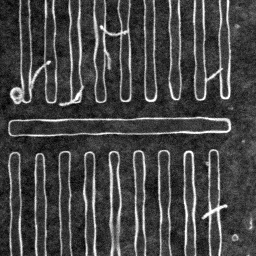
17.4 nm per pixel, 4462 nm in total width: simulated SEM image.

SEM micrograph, groups of lines, slits or small figures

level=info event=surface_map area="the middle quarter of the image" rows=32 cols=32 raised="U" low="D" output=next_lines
DDUUDDDDUUDDDDUUDDDDUUUDDDDUUDDD
DDUUDDDDUUDDDDUUUDDDUUUDDDDUUDDD
DDUUDDDDUUDDDDUUUDDDUUUDDDUUUDDD
DDUUDDDDUUDDDDUUUDDDUUUDDDUUUDDD
DDUUDDDDUUDDDDUUUDDDUUUDDDUUUDDD
DDUUUDDDUUDDDDUUUDDDUUUDDDUUUDDD
DDUUUDDDUUDDDDUUUDDDUUUDDDDUUDDD
DDUUDDDDUUDDDDUUUDDDUUUDDDDUUDDD
DDUUDDDDUUDDDDUUUDDDUUUDDDDUUDDD
DDUUDDDDDUDDDDDDDDDDDDDDDDDDDDDD
DDDDDDDDDDDDDDDDDDDDDDDDDDDDDDDD
DDDDDDDDDDDDDDDDDDDDDDDDDDDDDDDD
DDDDDDDDDDDDDDDDDDDDDDDDDDDDDDDD
DDDDDDDDDDDDDDDDDDDDDDDDDDDDDDDD
UUUUUUUUUUUUUUUUUUUUUUUUUUUUUUUU
UUUUUUUUUUUUUUUUUUUUUUUUUUUUUUUU
UUUUUUUUUUUUUUUUUUUUUUUUUUUUUUUU
UUUUDDUUUDDDDDDDDDDDDDDDDDDDDDDD
DDDDDDDDDDDDDDDDDDDDDDDDDDDDDDDD
DDDDDDDDDDDDDDDDDDDDDDDDDDDDDDDD
DDDDDDDDDDDDDDDDDDDDDDDDDDDDDDDD
DDDDDDDDDDDDDDDDDDDDDDDDDDDDDDDD
UDDDDDUDDDDDUDDDDDUUDDDDUUDDDDUU
UDDDDUUDDDDUUUDDDDUUDDDDUUDDDDUU
UDDDDUUDDDDDUUDDDDUUDDDDUUDDDDUU
UDDDDUUDDDDDUUDDDDUUDDDDUUDDDDUU
UDDDDUUDDDDDUDDDDDUUDDDDUUDDDDUU
UDDDDUUDDDDDUDDDDDUUDDDDUUDDDDUU
UDDDDUUDDDDDUUDDDDUUDDDDUUDDDDUU
UDDDDUUDDDDDUUDDDDUUDDDDUUDDDDUU
UDDDDUUDDDDDUUDDDDUUDDDDUUDDDDUU
UUDDDUUDDDDDUUDDDDUUDDDDUUDDDDUU